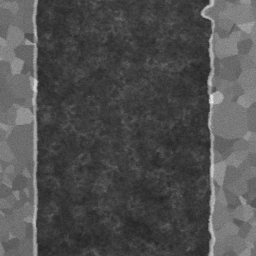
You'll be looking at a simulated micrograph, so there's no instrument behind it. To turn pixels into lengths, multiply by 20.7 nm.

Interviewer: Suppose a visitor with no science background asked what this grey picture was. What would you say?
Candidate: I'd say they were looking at one or a few lines or trenches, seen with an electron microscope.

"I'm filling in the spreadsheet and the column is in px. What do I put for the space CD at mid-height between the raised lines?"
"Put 177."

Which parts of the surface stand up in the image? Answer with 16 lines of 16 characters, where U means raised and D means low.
UUDDDDDDDDDDDUUU
UUDDDDDDDDDDDUUU
UUDDDDDDDDDDDUUU
UUDDDDDDDDDDDUUU
UUDDDDDDDDDDDUUU
UUDDDDDDDDDDDUUU
UUDDDDDDDDDDDUUU
UUDDDDDDDDDDDUUU
UUDDDDDDDDDDDUUU
UUDDDDDDDDDDDUUU
UUDDDDDDDDDDDUUU
UUDDDDDDDDDDDUUU
UUDDDDDDDDDDDUUU
UUDDDDDDDDDDDUUU
UUDDDDDDDDDDDUUU
UUDDDDDDDDDDDUUU